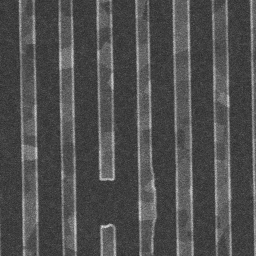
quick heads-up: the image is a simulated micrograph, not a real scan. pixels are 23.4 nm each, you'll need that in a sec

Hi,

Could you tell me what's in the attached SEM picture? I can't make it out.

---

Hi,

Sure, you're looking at parallel lines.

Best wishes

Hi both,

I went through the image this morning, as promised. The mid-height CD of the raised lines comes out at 13.2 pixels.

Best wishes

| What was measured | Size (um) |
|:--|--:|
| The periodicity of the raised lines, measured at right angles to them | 0.904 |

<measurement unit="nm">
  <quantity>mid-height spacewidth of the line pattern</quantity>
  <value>595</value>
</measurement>